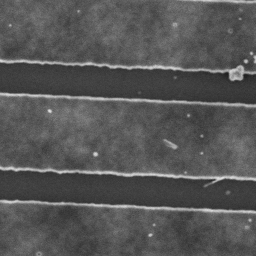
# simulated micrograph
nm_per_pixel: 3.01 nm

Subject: lines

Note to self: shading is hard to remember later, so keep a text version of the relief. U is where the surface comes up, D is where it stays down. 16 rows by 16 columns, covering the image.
UUUUUUUUUUUUUUUU
UUUUUUUUUUUUUUUU
UUUUUUUUUUUUUUUU
UUUUUUUUUUUUUUUU
DDDDDDDDDDDDDUUU
DDDDDDDDDDDDDDDD
UUUUUUUUUUUUUUUD
UUUUUUUUUUUUUUUU
UUUUUUUUUUUUUUUU
UUUUUUUUUUUUUUUU
UUUUUUUUUUUUUUUU
DDDDDDDDDDDDDDDD
DDDDDDDDDDDDDDDD
UUUUUUUUUUUUUUUU
UUUUUUUUUUUUUUUU
UUUUUUUUUUUUUUUU